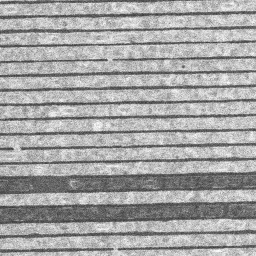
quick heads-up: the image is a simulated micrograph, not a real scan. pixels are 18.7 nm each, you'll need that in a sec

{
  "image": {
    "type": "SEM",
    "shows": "parallel lines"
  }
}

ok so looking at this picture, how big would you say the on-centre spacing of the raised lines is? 0.273 µm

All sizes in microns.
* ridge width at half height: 0.21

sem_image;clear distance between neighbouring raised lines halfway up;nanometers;65.3